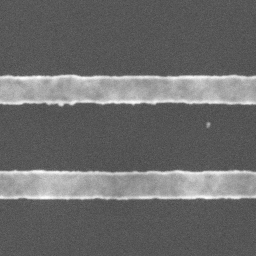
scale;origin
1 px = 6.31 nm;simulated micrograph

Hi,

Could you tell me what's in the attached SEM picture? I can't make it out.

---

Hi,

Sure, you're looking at lines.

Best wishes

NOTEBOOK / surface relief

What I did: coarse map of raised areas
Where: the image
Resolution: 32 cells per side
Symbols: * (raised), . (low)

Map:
................................
................................
................................
................................
................................
................................
................................
................................
................................
.......***..................**..
********************************
********************************
********************************
................................
................................
................................
................................
................................
................................
................................
................................
**********.**...*.******.*******
********************************
********************************
********************************
................................
................................
................................
................................
................................
................................
................................